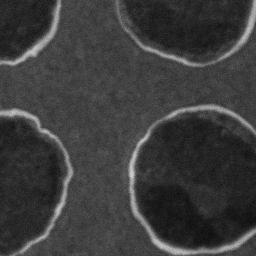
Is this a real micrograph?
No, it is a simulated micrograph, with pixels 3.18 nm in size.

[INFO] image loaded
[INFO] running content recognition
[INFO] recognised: raised bodies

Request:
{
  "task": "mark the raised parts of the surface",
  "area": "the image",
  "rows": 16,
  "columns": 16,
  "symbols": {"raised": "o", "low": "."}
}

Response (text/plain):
oooo...ooooooooo
ooo.....oooooooo
ooo.....ooooooo.
oo........oooo..
................
................
................
oo........ooooo.
ooo......ooooooo
oooo....oooooooo
oooo....oooooooo
oooo....oooooooo
oooo....oooooooo
oooo.....ooooooo
ooo......ooooooo
oo........oooo..